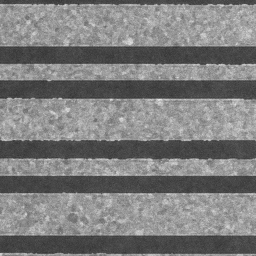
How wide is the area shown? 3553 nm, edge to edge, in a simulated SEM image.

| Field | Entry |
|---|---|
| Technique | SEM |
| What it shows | lines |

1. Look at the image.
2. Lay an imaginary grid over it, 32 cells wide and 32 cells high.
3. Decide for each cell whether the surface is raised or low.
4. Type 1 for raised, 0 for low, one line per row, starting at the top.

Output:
00000000000000000000000000000000
11111111111111111111111111111111
11111111111111111111111111111111
11111111111111111111111111111111
11111111111111111111111111111111
11111111111111111111111111111111
00000000000000000000000000000000
00000000000000000000000000000000
11111111111111111111111111111111
11111111111111111111111111111111
00000000000000000000000000000000
00000000000000000000000000000000
11111111111111111111111111111110
11111111111111111111111111111111
11111111111111111111111111111111
11111111111111111111111111111111
11111111111111111111111111111111
11110101111011100110101100110000
00000000000000000000000000000000
00000000000000000000000000000000
11111111111111111111111111111111
11111111111111111111111111111111
00000000000000000000000000000000
00000000000000000000000000000000
11111111111111111111111111111111
11111111111111111111111111111111
11111111111111111111111111111111
11111111111111111111111111111111
11111111111111111111111111111111
00000000000000000000000000000000
00000000000000000000000000000000
00000000000000000000000000000000